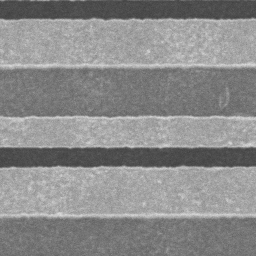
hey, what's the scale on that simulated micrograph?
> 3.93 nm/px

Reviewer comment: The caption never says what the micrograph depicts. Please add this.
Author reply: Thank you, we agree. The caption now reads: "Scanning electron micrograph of lines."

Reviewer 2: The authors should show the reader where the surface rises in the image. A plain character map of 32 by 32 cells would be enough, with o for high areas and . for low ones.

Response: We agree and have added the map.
................................
................................
ooooooooooooo.oooooooooooooooooo
oooooooooooooooooooooooooooooooo
oooooooooooooooooooooooooooooooo
oooooooooooooooooooooooooooooooo
oooooooooooooooooooooooooooooooo
oooooooooooooooooooooooooooooooo
................................
................................
................................
................................
................................
................................
................................
oooooooooooooooooooooooooooooooo
oooooooooooooooooooooooooooooooo
oooooooooooooooooooooooooooooooo
................................
................................
................................
oooooooooooooooooooooooooooooooo
oooooooooooooooooooooooooooooooo
oooooooooooooooooooooooooooooooo
oooooooooooooooooooooooooooooooo
oooooooooooooooooooooooooooooooo
oooooooooooooooooooooooooooooooo
................................
................................
................................
................................
................................